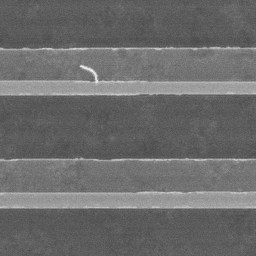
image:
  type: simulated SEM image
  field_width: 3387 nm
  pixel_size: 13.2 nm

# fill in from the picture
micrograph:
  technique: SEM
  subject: lines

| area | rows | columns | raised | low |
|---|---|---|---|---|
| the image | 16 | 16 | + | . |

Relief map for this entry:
................
................
................
++++++++++++++++
++++++++++++++++
++++++++++++++++
................
................
................
................
++++++++++++++++
++++++++++++++++
++++++++++++++++
................
................
................